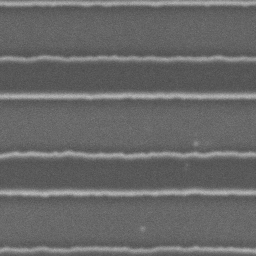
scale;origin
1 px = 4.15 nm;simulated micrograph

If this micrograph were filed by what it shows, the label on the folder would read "lines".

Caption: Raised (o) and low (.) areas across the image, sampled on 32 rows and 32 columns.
ooooooooooooooooo.ooo....oo..ooo
................................
................................
................................
................................
................................
................................
oooooooooooooooooooooooooooooooo
oooooooooooooooooooooooooooooooo
oooooooooooooooooooooooooooooooo
oooooooooooooooooooooooooooooooo
oooooooooooooooooooooooooooooooo
................................
................................
................................
................................
................................
................................
................................
oooooooooooooooooooooooooooooooo
oooooooooooooooooooooooooooooooo
oooooooooooooooooooooooooooooooo
oooooooooooooooooooooooooooooooo
oooooooooooooooooooooooooooooooo
................................
................................
................................
................................
................................
................................
................................
oooooooooooooooooooooooooooooooo